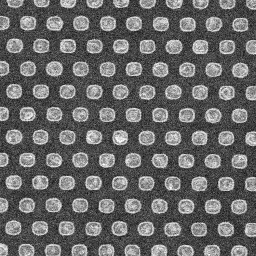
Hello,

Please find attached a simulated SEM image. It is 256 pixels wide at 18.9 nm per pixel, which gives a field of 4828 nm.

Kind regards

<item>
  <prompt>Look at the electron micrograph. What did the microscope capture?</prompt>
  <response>a regular array of raised bodies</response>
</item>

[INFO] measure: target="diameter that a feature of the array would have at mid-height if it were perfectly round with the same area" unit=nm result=282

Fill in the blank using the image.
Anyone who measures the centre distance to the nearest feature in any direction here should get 492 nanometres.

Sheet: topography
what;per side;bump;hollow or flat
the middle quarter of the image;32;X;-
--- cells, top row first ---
---XXX---XXXX---XXX---XXXX---XXX
---XXX---XXXX---XXX---XXXX---XXX
---XXX---XXXX---XXX----XXX---XXX
--------------------------------
--------------------------------
XX----XXX----XX-----------------
XXX---XXX---XXXX---XXX----XXX---
XXX---XXX---XXXX---XXX----XXX---
X------X-----------XXX----XXX---
--------------------------------
--------------------------------
---XXX---XXX----XXX----XX----XXX
---XXX---XXXX---XXX---XXXX---XXX
---XXX---XXX----XXX---XXXX---XXX
--------------------------------
--------------------------------
--------------------------------
XXX---XXX---XXXX---XXX----XXX---
XXX---XXX---XXXX---XXX----XXX---
XX----XXX----XX----XXX----XXX---
--------------------------------
--------------------------------
---XX---------------------------
--XXXX---XXXX---XXX---XXXX---XXX
--XXXX---XXXX---XXX---XXXX---XXX
---------XXX----XX-----XX----XXX
--------------------------------
--------------------------------
XX----XXX----XX----XXX----XX----
XXX---XXX---XXXX---XXX----XXX---
XX----XXX---XXXX---XXX----XXX---
--------------------------------